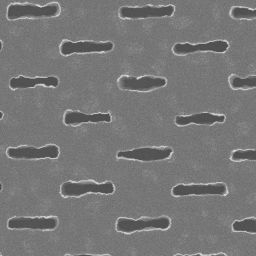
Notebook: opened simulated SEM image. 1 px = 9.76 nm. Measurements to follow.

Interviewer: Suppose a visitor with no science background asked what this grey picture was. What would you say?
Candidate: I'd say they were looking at a regular array of holes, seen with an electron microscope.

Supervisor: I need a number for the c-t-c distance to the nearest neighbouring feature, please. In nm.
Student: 616